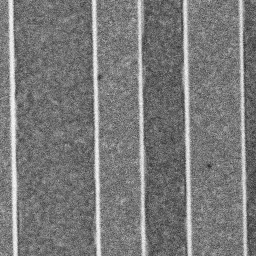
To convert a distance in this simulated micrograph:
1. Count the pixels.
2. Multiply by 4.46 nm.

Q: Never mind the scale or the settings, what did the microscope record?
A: one or a few lines or trenches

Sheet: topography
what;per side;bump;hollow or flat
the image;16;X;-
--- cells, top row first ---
X-----XXX---XXX-
X-----XXX---XXX-
X-----XXX---XXX-
X-----XXX---XXX-
X-----XXX---XXX-
X-----XXX---XXX-
X-----XXX---XXX-
X-----XXX---XXX-
X-----XXX---XXX-
X-----XXX---XXX-
X-----XXX---XXX-
X-----XXX---XXX-
X-----XXX---XXX-
X-----XXX---XXX-
X-----XXX---XXX-
X-----XXX---XXX-